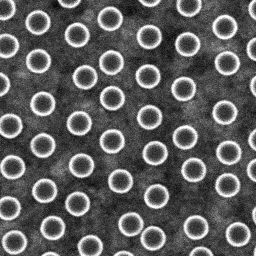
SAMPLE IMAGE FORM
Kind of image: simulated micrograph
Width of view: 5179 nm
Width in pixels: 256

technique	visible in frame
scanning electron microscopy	a regular array of raised bodies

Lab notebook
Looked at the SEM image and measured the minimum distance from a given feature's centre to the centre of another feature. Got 749 nm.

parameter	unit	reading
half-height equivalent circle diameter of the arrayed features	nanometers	464